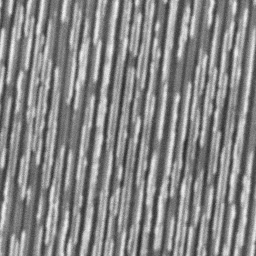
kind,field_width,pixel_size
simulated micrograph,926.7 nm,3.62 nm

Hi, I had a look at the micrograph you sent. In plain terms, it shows parallel lines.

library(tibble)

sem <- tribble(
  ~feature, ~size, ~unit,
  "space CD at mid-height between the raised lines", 18.9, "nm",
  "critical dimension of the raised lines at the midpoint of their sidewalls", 25.2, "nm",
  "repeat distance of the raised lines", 42.6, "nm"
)